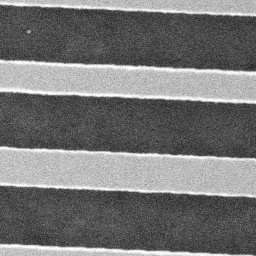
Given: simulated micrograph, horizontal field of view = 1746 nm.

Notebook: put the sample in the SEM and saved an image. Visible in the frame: lines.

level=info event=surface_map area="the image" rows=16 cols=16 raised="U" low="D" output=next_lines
DDDDUUUUUUUUUUUU
DDDDDDDDDDDDDDDD
DDDDDDDDDDDDDDDD
DDDDDDDDDDDDDDDD
UUUUUUUUUUUUUUUD
UUUUUUUUUUUUUUUU
DDDDDDDDDDDDDDDD
DDDDDDDDDDDDDDDD
DDDDDDDDDDDDDDDD
UUUUUUDDDDDDDDDD
UUUUUUUUUUUUUUUU
UUUUUUUUUUUUUUUU
DDDDDDDDDDDDDDDD
DDDDDDDDDDDDDDDD
DDDDDDDDDDDDDDDD
UUUUUUDDDDDDDDDD